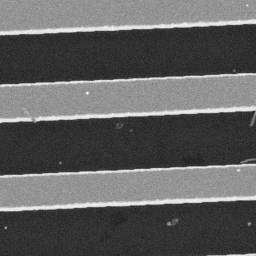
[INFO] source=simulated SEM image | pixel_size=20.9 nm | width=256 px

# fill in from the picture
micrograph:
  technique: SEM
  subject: lines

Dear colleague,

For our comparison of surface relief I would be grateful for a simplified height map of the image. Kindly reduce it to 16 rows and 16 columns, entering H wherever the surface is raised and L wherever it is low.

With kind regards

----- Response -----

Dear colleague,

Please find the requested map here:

HHHHHHHHHHHHHHHH
HHHHHHHHHHHHHHHL
LLLLLLLLLLLLLLLL
LLLLLLLLLLLLLLLL
LLLLLLLLLLLLLLLL
HHHHHHHHHHHHHHHH
HHHHHHHHHHHHHHHH
HHHLLLLLLLLLLLLL
LLLLLLLLLLLLLLLL
LLLLLLLLLLLLLLLL
LLLLLLLLLLHHHHHH
HHHHHHHHHHHHHHHH
HHHHHHHHHHHHHHLL
LLLLLLLLLLLLLLLL
LLLLLLLLLLLLLLLL
LLLLLLLLLLLLLLLL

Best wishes